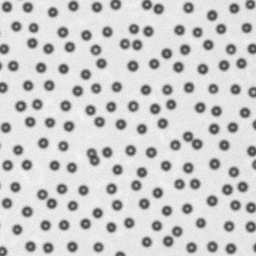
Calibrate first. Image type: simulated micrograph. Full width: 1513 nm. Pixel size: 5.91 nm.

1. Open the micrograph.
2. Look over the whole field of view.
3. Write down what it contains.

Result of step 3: a regular array of ring-shaped grooves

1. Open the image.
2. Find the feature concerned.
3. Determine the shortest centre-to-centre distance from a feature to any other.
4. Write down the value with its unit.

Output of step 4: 107 nm